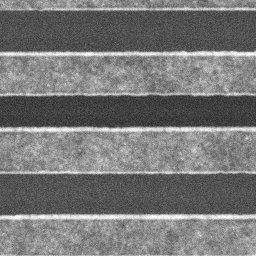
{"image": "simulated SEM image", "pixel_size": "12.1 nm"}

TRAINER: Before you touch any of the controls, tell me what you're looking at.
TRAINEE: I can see lines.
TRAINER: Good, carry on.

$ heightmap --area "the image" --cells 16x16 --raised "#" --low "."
################
................
................
################
################
################
................
................
################
################
################
................
................
................
################
################